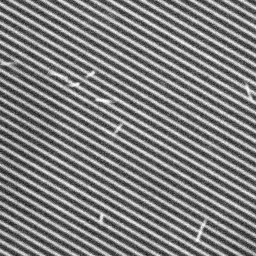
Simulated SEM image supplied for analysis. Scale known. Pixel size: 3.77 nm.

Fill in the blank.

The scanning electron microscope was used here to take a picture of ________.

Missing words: parallel lines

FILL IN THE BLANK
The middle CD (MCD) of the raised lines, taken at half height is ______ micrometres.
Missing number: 0.0082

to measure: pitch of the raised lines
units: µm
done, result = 0.031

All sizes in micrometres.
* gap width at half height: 0.0246